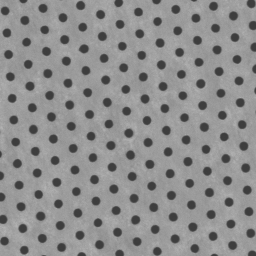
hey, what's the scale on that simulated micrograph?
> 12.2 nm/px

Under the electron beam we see a regular array of holes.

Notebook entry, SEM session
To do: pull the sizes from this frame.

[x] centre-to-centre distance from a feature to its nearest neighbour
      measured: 261 nm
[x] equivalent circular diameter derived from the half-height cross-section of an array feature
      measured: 102 nm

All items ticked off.